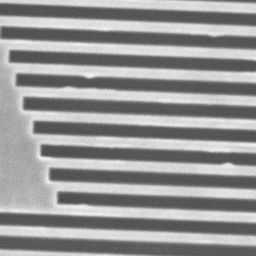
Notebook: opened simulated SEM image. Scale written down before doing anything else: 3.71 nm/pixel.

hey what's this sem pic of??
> parallel lines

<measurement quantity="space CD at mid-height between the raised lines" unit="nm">43.6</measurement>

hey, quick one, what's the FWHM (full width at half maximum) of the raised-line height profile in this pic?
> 0.0431 um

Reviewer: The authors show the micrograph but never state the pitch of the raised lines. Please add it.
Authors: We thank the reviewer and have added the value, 23.3 pixels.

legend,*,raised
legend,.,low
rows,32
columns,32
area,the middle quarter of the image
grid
********........................
********************************
********************************
...............*****************
................................
................................
***********.....................
********************************
********************************
...................*************
................................
................................
***************.................
********************************
********************************
......................**********
................................
................................
*******************.............
********************************
..******************************
..........................******
................................
................................
***********************.........
********************************
...........*********************
..............................**
................................
**..............................
**************************......
********************************